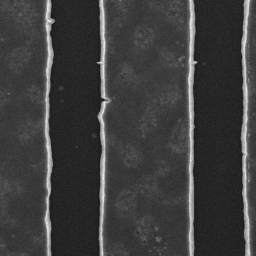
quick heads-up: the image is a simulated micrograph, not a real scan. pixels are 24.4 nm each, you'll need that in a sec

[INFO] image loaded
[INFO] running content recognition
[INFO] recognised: one or a few lines or trenches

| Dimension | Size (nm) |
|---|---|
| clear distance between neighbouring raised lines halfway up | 1280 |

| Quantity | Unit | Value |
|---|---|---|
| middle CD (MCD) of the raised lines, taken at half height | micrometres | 2.19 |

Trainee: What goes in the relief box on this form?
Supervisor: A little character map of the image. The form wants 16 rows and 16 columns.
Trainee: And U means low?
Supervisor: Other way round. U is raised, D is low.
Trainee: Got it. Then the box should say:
UUUDDDUUUUUUDDDU
UUUDDDUUUUUUDDDU
UUUDDDUUUUUUDDDU
UUUDDDUUUUUUDDDU
UUUDDDUUUUUUDDDU
UUUDDDUUUUUUDDDU
UUUDDDUUUUUUDDDU
UUUDDDUUUUUUDDDU
UUUDDDUUUUUUDDDU
UUUDDDUUUUUUDDDU
UUUDDDUUUUUUDDDU
UUUDDDUUUUUUDDDU
UUUDDDUUUUUUDDDU
UUUDDDUUUUUUDDDU
UUUDDDUUUUUUDDDU
UUUDDDUUUUUUDDDU